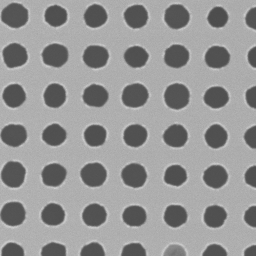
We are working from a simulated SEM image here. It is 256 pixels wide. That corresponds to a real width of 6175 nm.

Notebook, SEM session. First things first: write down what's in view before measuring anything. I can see a regular array of holes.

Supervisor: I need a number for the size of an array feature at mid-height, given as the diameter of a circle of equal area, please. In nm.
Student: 587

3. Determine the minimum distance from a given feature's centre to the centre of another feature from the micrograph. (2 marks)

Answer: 956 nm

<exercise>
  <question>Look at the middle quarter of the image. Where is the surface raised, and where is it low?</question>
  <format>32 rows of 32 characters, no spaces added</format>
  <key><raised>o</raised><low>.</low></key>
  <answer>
oooooo....oooooo....oooooo....oo
oooooooooooooooooooooooooooooooo
oooooooooooooooooooooooooooooooo
oooooooooooooooooooooooooooooooo
oooooooooooooooooooooooooooooooo
oooooo....oooooo....oooooo.....o
ooooo......oooo......oooo......o
.oooo......ooo.......oooo......o
.oooo......ooo.......oooo......o
ooooo.....oooo.......oooo......o
oooooo....oooooo....oooooo....oo
oooooooooooooooooooooooooooooooo
oooooooooooooooooooooooooooooooo
oooooooooooooooooooooooooooooooo
oooooooooooooooooooooooooooooooo
oooooo....oooooo....oooooo....oo
ooooo......oooo......ooooo.....o
.oooo......oooo......oooo......o
.oooo......oooo......oooo......o
ooooo.....ooooo.....ooooo......o
oooooo...ooooooo...ooooooo....oo
oooooooooooooooooooooooooooooooo
oooooooooooooooooooooooooooooooo
oooooooooooooooooooooooooooooooo
oooooooooooooooooooooooooooooooo
ooooo.....ooooo.....oooooo...ooo
.ooo......ooooo.....ooooo.....oo
.ooo.......ooo.......oooo......o
oooo.......ooo.......oooo......o
ooooo.....ooooo.....ooooo.....oo
oooooo...ooooooo....ooooooo.oooo
oooooooooooooooooooooooooooooooo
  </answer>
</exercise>